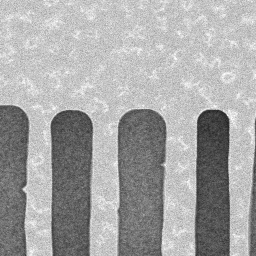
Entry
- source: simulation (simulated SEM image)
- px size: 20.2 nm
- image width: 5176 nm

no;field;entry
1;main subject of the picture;one or a few lines or trenches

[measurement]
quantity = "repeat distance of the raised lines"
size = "1.36 microns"